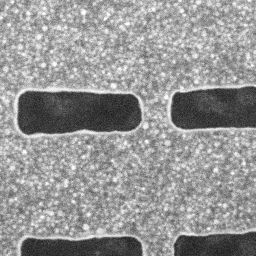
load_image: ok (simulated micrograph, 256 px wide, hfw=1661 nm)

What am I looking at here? holes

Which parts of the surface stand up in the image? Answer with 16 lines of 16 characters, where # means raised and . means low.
################
################
################
################
################
#############...
#........##.....
#........##.....
################
################
################
################
################
################
################
#........##.....